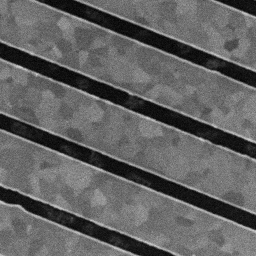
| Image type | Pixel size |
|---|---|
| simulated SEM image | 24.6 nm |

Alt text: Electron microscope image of one or a few lines or trenches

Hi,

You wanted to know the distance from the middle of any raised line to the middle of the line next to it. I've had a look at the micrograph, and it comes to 1640 nm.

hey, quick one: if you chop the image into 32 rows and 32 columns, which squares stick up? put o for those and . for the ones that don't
ooooo......ooooooooooooooooo....
oooooooo.....ooooooooooooooooo..
oooooooooo......oooooooooooooooo
ooooooooooooo......ooooooooooooo
ooooooooooooooo......ooooooooooo
.ooooooooooooooooo......oooooooo
....oooooooooooooooo......oooooo
......ooooooooooooooooo.....oooo
oo.......oooooooooooooooo......o
ooooo......ooooooooooooooooo....
oooooooo......oooooooooooooooo..
oooooooooo......oooooooooooooooo
ooooooooooooo......ooooooooooooo
ooooooooooooooo......ooooooooooo
.ooooooooooooooooo......oooooooo
....oooooooooooooooo......oooooo
o.....ooooooooooooooooo......ooo
ooo......oooooooooooooooo......o
oooooo.....ooooooooooooooooo....
oooooooo......ooooooooooooooooo.
ooooooooooo.....oooooooooooooooo
ooooooooooooo......ooooooooooooo
oooooooooooooooo.....ooooooooooo
.ooooooooooooooooo......oooooooo
....ooooooooooooooooo.....oooooo
o.....ooooooooooooooooo......ooo
ooo......ooooooooooooooooo.....o
oooooo.....ooooooooooooooooo....
oooooooo......ooooooooooooooooo.
ooooooooooo.....oooooooooooooooo
ooooooooooooo......ooooooooooooo
oooooooooooooooo.....ooooooooooo